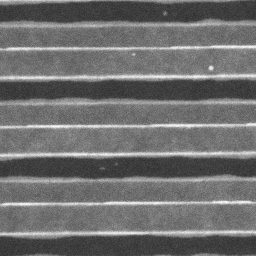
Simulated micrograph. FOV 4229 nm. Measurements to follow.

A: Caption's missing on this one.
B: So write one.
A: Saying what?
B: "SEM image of lines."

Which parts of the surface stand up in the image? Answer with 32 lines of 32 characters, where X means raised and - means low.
--------------------------------
--------------------------------
--------------------------------
XXXXXXXXXXXXXXXXXXXXXXXXXXXXXXXX
XXXXXXXXXXXXXXXXXXXXXXXXXXXXXXXX
XXXXXXXXXXXXXXXXXXXXXXXXXXXXXXXX
XXXXXXXXXXXXXXXXXXXXXXXXXXXXXXXX
XXXXXXXXXXXXXXXXXXXXXXXXXXXXXXXX
XXXXXXXXXXXXXXXXXXXXXXXXXXXXXXXX
XXXXXXXXXXXXXXXXXXXXXXXXXXXXXXXX
--------------------------------
--------------------------------
--------------------------------
XXXXXXXXXXXXXXXXXXXXXXXXXXXXXXXX
XXXXXXXXXXXXXXXXXXXXXXXXXXXXXXXX
XXXXXXXXXXXXXXXXXXXXXXXXXXXXXXXX
XXXXXXXXXXXXXXXXXXXXXXXXXXXXXXXX
XXXXXXXXXXXXXXXXXXXXXXXXXXXXXXXX
XXXXXXXXXXXXXXXXXXXXXXXXXXXXXXXX
X-------------------------------
--------------------------------
--------------------------------
----------------XXXXXXXXXXXXXXXX
XXXXXXXXXXXXXXXXXXXXXXXXXXXXXXXX
XXXXXXXXXXXXXXXXXXXXXXXXXXXXXXXX
XXXXXXXXXXXXXXXXXXXXXXXXXXXXXXXX
XXXXXXXXXXXXXXXXXXXXXXXXXXXXXXXX
XXXXXXXXXXXXXXXXXXXXXXXXXXXXXXXX
XXXXXXXXXXXXXXXXXXXXXXXXXXXXXXXX
--------------------------------
--------------------------------
--------------------------------